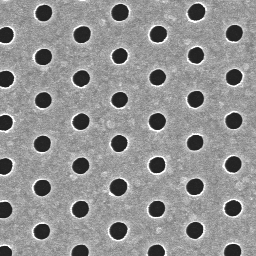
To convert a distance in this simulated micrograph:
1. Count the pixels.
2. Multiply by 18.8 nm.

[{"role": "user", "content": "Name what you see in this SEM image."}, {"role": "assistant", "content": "a regular array of holes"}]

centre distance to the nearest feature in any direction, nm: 817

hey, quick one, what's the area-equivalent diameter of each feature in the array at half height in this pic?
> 319 nm